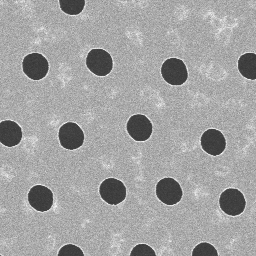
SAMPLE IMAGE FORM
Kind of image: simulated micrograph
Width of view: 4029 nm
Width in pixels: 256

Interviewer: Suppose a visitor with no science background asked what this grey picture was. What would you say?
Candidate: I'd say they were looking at a regular array of holes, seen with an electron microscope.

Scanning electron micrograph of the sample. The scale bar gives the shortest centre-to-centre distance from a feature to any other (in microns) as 1.01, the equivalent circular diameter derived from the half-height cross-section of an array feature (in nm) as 421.